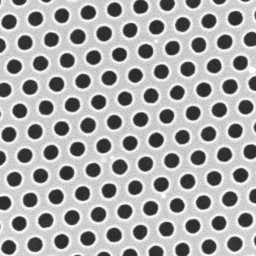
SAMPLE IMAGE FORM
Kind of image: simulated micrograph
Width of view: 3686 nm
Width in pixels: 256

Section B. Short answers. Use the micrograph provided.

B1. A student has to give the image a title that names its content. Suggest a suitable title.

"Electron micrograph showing a regular array of holes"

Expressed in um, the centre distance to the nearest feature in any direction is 0.372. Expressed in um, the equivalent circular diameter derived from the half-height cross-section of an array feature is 0.225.